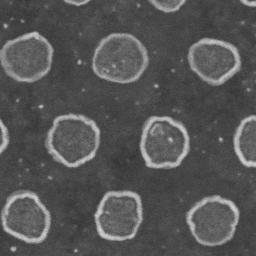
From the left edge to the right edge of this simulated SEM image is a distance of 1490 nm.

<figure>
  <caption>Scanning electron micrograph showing a regular array of raised bodies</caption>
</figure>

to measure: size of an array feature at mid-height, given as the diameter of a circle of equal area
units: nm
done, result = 278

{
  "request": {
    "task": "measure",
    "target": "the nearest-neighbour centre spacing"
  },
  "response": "0.533 um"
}